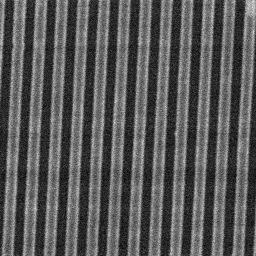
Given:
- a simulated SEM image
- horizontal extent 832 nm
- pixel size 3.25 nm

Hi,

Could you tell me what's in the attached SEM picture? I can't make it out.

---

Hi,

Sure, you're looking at parallel lines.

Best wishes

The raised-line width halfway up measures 34.9 nanometers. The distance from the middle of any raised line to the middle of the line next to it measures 68 nm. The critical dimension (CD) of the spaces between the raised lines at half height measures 34.9 nm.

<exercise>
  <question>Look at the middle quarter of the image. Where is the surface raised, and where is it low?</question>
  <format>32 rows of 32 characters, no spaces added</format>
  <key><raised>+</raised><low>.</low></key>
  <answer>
...++...++...+++..+++...++...++.
...++...++...++...+++...++...++.
...++...++...++...+++...++...++.
...++...++...++...+++...++...++.
...++...++...++...+++...++...++.
..+++...++...++...+++...++...++.
..+++...++...++...+++..+++...++.
..+++...++...++...+++..+++...++.
..+++..+++...++...++...+++...++.
..+++..+++...++...++...+++..+++.
..+++..+++...++...++...+++..+++.
..+++...++...++...++...++...+++.
..+++...++...++...++...++...+++.
..+++..+++...++...++...++...+++.
..+++..+++...++...++...++...+++.
..++...+++...++...++...++...+++.
..++...+++..+++...++...++...+++.
..++...+++..+++...++...++...+++.
..++...++...+++...++...++...+++.
..++...++...+++...++...++...++..
..++...++...+++...++...++...++..
..++...++...+++..+++...++...++..
..++...++...+++..+++...++...++..
..++...++...+++..+++...++...++..
..++...++...+++..+++...++...++..
.+++...++...++...+++...++...++..
.+++...++...++...+++..+++...++..
.+++...++...++...+++..+++...++..
.+++...++...++...++...+++...++..
.+++...++...++...++...+++...++..
.+++...++...++...++...+++..+++..
.+++...++...++...++...+++..+++..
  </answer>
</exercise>